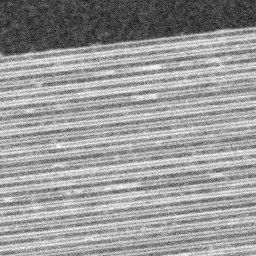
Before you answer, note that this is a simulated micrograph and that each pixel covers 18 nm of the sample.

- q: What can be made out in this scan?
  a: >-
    parallel lines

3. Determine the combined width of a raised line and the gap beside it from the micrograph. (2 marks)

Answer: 172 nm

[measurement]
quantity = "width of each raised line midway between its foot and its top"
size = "67 nm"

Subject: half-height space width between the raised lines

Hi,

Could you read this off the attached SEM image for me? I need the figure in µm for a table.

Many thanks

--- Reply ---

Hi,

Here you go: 0.107